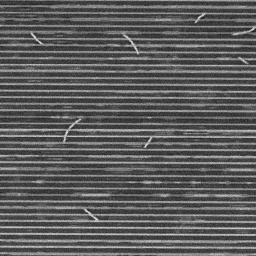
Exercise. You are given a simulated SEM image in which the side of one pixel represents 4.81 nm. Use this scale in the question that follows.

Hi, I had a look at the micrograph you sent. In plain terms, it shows parallel lines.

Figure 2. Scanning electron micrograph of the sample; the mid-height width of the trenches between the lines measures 24.7 nanometers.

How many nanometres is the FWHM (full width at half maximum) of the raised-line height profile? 8.4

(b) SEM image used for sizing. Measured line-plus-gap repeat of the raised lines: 31.4 nm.